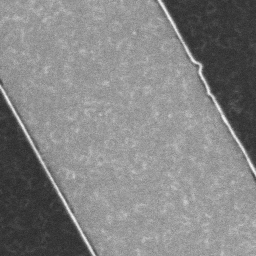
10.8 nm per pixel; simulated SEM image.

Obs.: one or a few lines or trenches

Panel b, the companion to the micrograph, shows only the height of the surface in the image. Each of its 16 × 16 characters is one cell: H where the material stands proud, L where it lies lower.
LLLLLLLLLLHHHHHH
LLLLLLLLLLLHHHHH
LLLLLLLLLLLHHHHH
LLLLLLLLLLLLHHHH
LLLLLLLLLLLLLHHH
LLLLLLLLLLLLLHHH
HLLLLLLLLLLLLHHH
HLLLLLLLLLLLLLHH
HHLLLLLLLLLLLLLH
HHLLLLLLLLLLLLLH
HHHLLLLLLLLLLLLL
HHHLLLLLLLLLLLLL
HHHHLLLLLLLLLLLL
HHHHHLLLLLLLLLLL
HHHHHLLLLLLLLLLL
HHHHHHLLLLLLLLLL